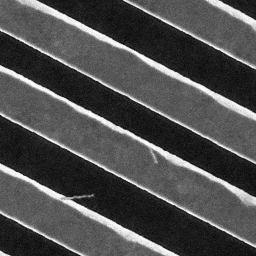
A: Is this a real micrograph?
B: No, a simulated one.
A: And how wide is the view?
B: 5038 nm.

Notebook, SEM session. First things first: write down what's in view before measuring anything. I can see lines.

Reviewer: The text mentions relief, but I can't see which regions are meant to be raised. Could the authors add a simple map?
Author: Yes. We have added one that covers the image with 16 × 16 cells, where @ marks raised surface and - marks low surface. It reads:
@@@------@@@@@--
@@@@@------@@@@@
-@@@@@@------@@@
---@@@@@@-----@@
@----@@@@@@-----
@@@----@@@@@@---
@@@@@----@@@@@@-
-@@@@@@----@@@@@
---@@@@@-----@@@
----@@@@@@----@@
------@@@@@@----
@@------@@@@@@--
@@@@------@@@@@@
@@@@@@------@@@@
--@@@@@@------@@
----@@@@@@------